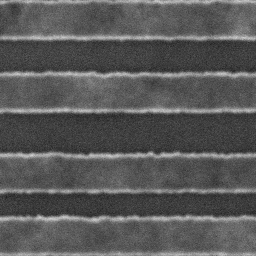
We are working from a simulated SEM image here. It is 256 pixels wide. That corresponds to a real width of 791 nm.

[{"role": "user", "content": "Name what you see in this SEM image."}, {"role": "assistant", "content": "lines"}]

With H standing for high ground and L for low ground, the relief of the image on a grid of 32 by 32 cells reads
HHHHHHHHHHHHHHHHHHHHHHHHHHHHHHHH
HHHHHHHHHHHHHHHHHHHHHHHHHHHHHHHH
HHHHHHHHHHHHHHHHHHHHHHHHHHHHHHHH
HHHHHHHHHHHHHHHHHHHHHHHHHHHHHHHH
HHHHHHHHHHHHHHHHHHHHHHHHHHHHHHHH
LLLLLLLLLLLLLLLLLLLLLLLLLLLLLLLL
LLLLLLLLLLLLLLLLLLLLLLLLLLLLLLLL
LLLLLLLLLLLLLLLLLLLLLLLLLLLLLLLL
LLLLLLLLLLLLLLLLLLLLLLLLLLLLLLLL
HHHHHHHHHHHHHHHHHHHHHHHHHHHHHHHH
HHHHHHHHHHHHHHHHHHHHHHHHHHHHHHHH
HHHHHHHHHHHHHHHHHHHHHHHHHHHHHHHH
HHHHHHHHHHHHHHHHHHHHHHHHHHHHHHHH
HHHHHHHHHHHHHHHHHHHHHHHHHHHHHHHH
LLLLLLLLLLLLLLLLLLLLLLLLLLLLLLLL
LLLLLLLLLLLLLLLLLLLLLLLLLLLLLLLL
LLLLLLLLLLLLLLLLLLLLLLLLLLLLLLLL
LLLLLLLLLLLLLLLLLLLLLLLLLLLLLLLL
LLLLLLLLLLLLLLLLLLLLLLLLLLLLLLLL
HHHHHHHHHHHHHHHHHHHHHHHHHHHHHHHH
HHHHHHHHHHHHHHHHHHHHHHHHHHHHHHHH
HHHHHHHHHHHHHHHHHHHHHHHHHHHHHHHH
HHHHHHHHHHHHHHHHHHHHHHHHHHHHHHHH
HHHHHHHHHHHHHHHHHHHHHHHHHHHHHHHH
LLLLLLLLLLLLLLLLLLLLLLLLLLLLLLLL
LLLLLLLLLLLLLLLLLLLLLLLLLLLLLLLL
LLLLLLLLLLLLLLLLLLLLLLLLLLLLLLLL
HHHHHHHHHHHHHHHHHHHHHHHHHHHHHHHH
HHHHHHHHHHHHHHHHHHHHHHHHHHHHHHHH
HHHHHHHHHHHHHHHHHHHHHHHHHHHHHHHH
HHHHHHHHHHHHHHHHHHHHHHHHHHHHHHHH
HHHHHHHHHHHHHHHHHHHHHHHHHHHHHHHH